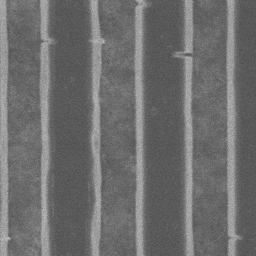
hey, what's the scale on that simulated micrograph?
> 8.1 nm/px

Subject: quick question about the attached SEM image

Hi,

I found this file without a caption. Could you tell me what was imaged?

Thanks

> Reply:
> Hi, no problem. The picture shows one or a few lines or trenches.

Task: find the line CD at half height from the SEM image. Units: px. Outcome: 49.4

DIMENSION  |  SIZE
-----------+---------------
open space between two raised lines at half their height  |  345 nm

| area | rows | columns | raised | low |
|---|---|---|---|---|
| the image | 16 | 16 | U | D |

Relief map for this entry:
DDDUUUDDDUUUDDUU
DDDUUUDDDUUUDDUU
DDDUUUDDDUUUDDUU
DDDUUUDDDUUUDDUU
DDDUUUDDDUUUDDUU
DDDUUUDDDUUUDDUU
DDDUUUDDDUUUDDUU
DDDUUUDDDUUUDDUU
DDDUUUDDDUUUDDUU
DDDUUUDDDUUUDDUU
DDDUUUDDDUUUDDUU
DDDUUUDDDUUUDDUU
DDDUUUDDDUUUDDUU
DDDUUUDDDUUUDDUU
DDDUUUDDDUUUDDDU
DDDUUUDDDUUUDDDU